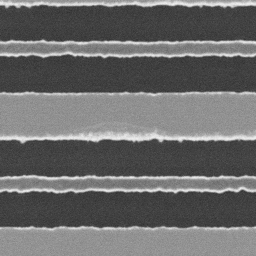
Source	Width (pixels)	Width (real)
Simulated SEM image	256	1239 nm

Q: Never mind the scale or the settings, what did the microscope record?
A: lines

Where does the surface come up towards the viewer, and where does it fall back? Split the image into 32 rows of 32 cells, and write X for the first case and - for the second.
XXXXXXXXXXXXXXXXXXXXXXXXXXXXXXXX
--------------------------------
--------------------------------
--------------------------------
--------------------------------
XXXXXXXXXXXXXXXXXXXXXXXXXXXXXXXX
XXXXXXXXXXXXXXXXXXXXXXXXXXXXXXXX
--------------------------------
--------------------------------
--------------------------------
--------------------------------
--------------------------------
XXXXXXXXXXXXXXXXXXXXXXXXXXXXXXXX
XXXXXXXXXXXXXXXXXXXXXXXXXXXXXXXX
XXXXXXXXXXXXXXXXXXXXXXXXXXXXXXXX
XXXXXXXXXXXXXXXXXXXXXXXXXXXXXXXX
XXXXXXXXXXXXXXXXXXXXXXXXXXXXXXXX
------------------------X-------
--------------------------------
--------------------------------
--------------------------------
--------------------------------
XXXXXXXXXXXXXXXXXXXXXXXXXXXXXXXX
XXXXXXXXXXXXXXXXXXXXXXXXXXXXXXXX
--------------------------------
--------------------------------
--------------------------------
--------------------------------
XXXXXXXXXXXXXXXXXXXXXXXXXXXXXXXX
XXXXXXXXXXXXXXXXXXXXXXXXXXXXXXXX
XXXXXXXXXXXXXXXXXXXXXXXXXXXXXXXX
XXXXXXXXXXXXXXXXXXXXXXXXXXXXXXXX